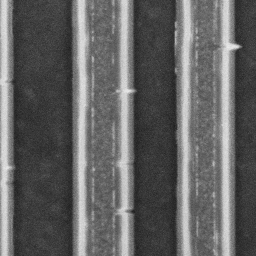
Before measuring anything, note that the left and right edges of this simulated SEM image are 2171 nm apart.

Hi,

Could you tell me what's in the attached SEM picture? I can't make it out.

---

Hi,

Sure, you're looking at one or a few lines or trenches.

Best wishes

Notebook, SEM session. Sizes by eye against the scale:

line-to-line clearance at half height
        0.595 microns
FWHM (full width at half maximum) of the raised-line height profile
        346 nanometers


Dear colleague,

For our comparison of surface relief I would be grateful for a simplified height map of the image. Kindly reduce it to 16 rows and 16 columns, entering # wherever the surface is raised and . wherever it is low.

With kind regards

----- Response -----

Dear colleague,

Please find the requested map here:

.....###....##..
.....###....##..
.....###....##..
.....###....##..
.....###....##..
.....###....##..
.....###....##..
.....###....##..
.....###....##..
.....###....##..
.....###....##..
.....###....##..
.....###....##..
.....###....##..
.....###....##..
.....###....##..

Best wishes